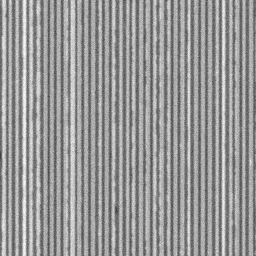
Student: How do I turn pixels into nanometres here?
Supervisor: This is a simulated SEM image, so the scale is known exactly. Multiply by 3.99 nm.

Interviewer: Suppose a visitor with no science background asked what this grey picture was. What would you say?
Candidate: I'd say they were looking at parallel lines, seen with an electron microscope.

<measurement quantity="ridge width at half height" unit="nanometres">10.5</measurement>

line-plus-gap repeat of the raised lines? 27.4 nanometres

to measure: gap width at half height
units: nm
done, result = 14